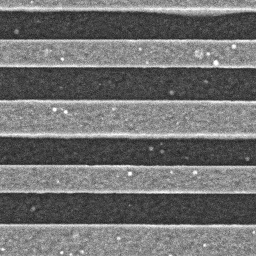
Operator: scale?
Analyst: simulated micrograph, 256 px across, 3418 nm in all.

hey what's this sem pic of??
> lines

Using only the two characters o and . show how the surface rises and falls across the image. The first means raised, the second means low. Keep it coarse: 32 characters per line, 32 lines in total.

oooooooooooooooooooooooooooooooo
................................
................................
................................
................................
oooooooooooooooooooooooooooooooo
oooooooooooooooooooooooooooooooo
oooooooooooooooooooooooooooooooo
................................
................................
................................
................................
................................
oooooooooooooooooooooooooooooooo
oooooooooooooooooooooooooooooooo
oooooooooooooooooooooooooooooooo
oooooooooooooooooooooooooooooooo
................................
................................
................................
................................
oooooooooooooooooooooooooooooooo
oooooooooooooooooooooooooooooooo
oooooooooooooooooooooooooooooooo
................................
................................
................................
................................
oooooooooooooooooooooooooooooooo
oooooooooooooooooooooooooooooooo
oooooooooooooooooooooooooooooooo
oooooooooooooooooooooooooooooooo